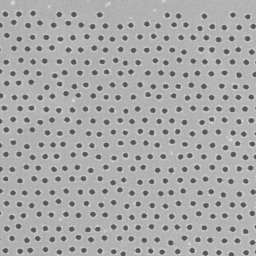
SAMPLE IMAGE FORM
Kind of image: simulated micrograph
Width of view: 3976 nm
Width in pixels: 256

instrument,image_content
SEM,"a regular array of holes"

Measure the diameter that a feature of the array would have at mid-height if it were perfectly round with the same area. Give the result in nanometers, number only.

89.3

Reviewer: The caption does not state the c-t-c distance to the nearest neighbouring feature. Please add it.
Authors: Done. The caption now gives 180 nm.